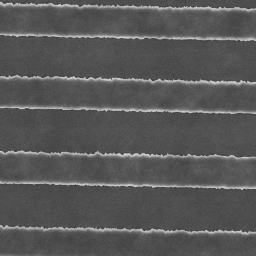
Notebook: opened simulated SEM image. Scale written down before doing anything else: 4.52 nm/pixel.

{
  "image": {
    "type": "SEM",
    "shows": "lines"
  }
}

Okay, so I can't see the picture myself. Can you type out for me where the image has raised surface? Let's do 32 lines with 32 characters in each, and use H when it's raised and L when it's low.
HHHHLLHLLLLLLLLLLLLLLLLLLLLLLLLL
HHHHHHHHHHHHHHHHHHHHHHHHHHHHHHHH
HHHHHHHHHHHHHHHHHHHHHHHHHHHHHHHH
HHHHHHHHHHHHHHHHHHHHHHHHHHHHHHHH
LLLLLLHHHHHHHHHHHHHHHHHHHHHHHHHH
LLLLLLLLLLLLLLLLLLLLLLLLLLLLLLLL
LLLLLLLLLLLLLLLLLLLLLLLLLLLLLLLL
LLLLLLLLLLLLLLLLLLLLLLLLLLLLLLLL
LLLLLLLLLLLLLLLLLLLLLLLLLLLLLLLL
LLLLLLLLLLLLLLLLLLLLLLLLLLLLLLLL
HHHHHHHHHHHHHHHHHHHHHHHHHHHHHHHH
HHHHHHHHHHHHHHHHHHHHHHHHHHHHHHHH
HHHHHHHHHHHHHHHHHHHHHHHHHHHHHHHH
LLHHHHHHHHHHHHHHHHHHHHHHHHHHHHHH
LLLLLLLLLLLLLLLLLLLLLLLLLLLLLLLL
LLLLLLLLLLLLLLLLLLLLLLLLLLLLLLLL
LLLLLLLLLLLLLLLLLLLLLLLLLLLLLLLL
LLLLLLLLLLLLLLLLLLLLLLLLLLLLLLLL
LLLLLLLLLLLLLLLLLLLLLLLLLLLLLLLL
HHHHHHHHHHHHHHHHHHHHHHHHHLHHLLLL
HHHHHHHHHHHHHHHHHHHHHHHHHHHHHHHH
HHHHHHHHHHHHHHHHHHHHHHHHHHHHHHHH
HHHHHHHHHHHHHHHHHHHHHHHHHHHHHHHH
LLLLLLLLLLLLLLLLLLLLLLLLLLLLHHHH
LLLLLLLLLLLLLLLLLLLLLLLLLLLLLLLL
LLLLLLLLLLLLLLLLLLLLLLLLLLLLLLLL
LLLLLLLLLLLLLLLLLLLLLLLLLLLLLLLL
LLLLLLLLLLLLLLLLLLLLLLLLLLLLLLLL
HHHHHHHHLHHLLLLLLLLLLLLLLLLLLLLL
HHHHHHHHHHHHHHHHHHHHHHHHHHHHHHHH
HHHHHHHHHHHHHHHHHHHHHHHHHHHHHHHH
HHHHHHHHHHHHHHHHHHHHHHHHHHHHHHHH